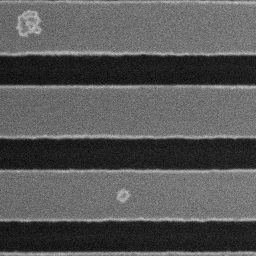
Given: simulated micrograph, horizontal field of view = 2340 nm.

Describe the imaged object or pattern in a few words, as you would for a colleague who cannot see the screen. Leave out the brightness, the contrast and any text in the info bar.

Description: lines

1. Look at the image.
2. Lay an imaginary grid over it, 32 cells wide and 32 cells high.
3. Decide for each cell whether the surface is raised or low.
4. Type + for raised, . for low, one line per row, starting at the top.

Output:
++++++++++++++++++++++++++++++++
++++++++++++++++++++++++++++++++
++++++++++++++++++++++++++++++++
++++++++++++++++++++++++++++++++
++++++++++++++++++++++++++++++++
++++++++++++++++++++++++++++++++
++++++++++++++++++++++++++++++++
................................
................................
................................
................................
++++++++++++++++++++++++++++++++
++++++++++++++++++++++++++++++++
++++++++++++++++++++++++++++++++
++++++++++++++++++++++++++++++++
++++++++++++++++++++++++++++++++
++++++++++++++++++++++++++++++++
................................
................................
................................
................................
++++++++++++++++++++++++++++++++
++++++++++++++++++++++++++++++++
++++++++++++++++++++++++++++++++
++++++++++++++++++++++++++++++++
++++++++++++++++++++++++++++++++
++++++++++++++++++++++++++++++++
++++++++++++++++++++++++++++++++
................................
................................
................................
................................